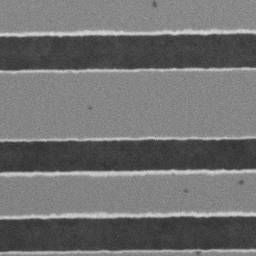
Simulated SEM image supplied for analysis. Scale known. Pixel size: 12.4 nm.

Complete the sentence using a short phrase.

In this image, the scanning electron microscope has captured lines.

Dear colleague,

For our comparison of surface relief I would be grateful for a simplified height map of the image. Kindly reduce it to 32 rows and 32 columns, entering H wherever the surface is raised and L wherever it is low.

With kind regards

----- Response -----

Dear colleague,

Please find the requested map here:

HHHHHHHHHHHHHHHHHHHHHHHHHHHHHHHH
HHHHHHHHHHHHHHHHHHHHHHHHHHHHHHHH
HHHHHHHHHHHHHHHHHHHHHHHHHHHHHHHH
HHHHHHHHHHHHHHHHHHHHHHHHHHHHHHHH
HHHHLLLHLLLLLLLLLLLLLLLLLLLLLLLL
LLLLLLLLLLLLLLLLLLLLLLLLLLLLLLLL
LLLLLLLLLLLLLLLLLLLLLLLLLLLLLLLL
LLLLLLLLLLLLLLLLLLLLLLLLLLLLLLLL
LLLLLLLLLLLLLLLLLLLLLLLLLLLLLLLL
HHHHHHHHHHHHHHHHHHHHHHHHHHHHHHHH
HHHHHHHHHHHHHHHHHHHHHHHHHHHHHHHH
HHHHHHHHHHHHHHHHHHHHHHHHHHHHHHHH
HHHHHHHHHHHHHHHHHHHHHHHHHHHHHHHH
HHHHHHHHHHHHHHHHHHHHHHHHHHHHHHHH
HHHHHHHHHHHHHHHHHHHHHHHHHHHHHHHH
HHHHHHHHHHHHHHHHHHHHHHHHHHHHHHHH
HHHHHHHHHHHHHHHHHHHHHHHHHHHHHHHH
HHHHHHHHHHHHHHLLLLLLLLLLLLLLLLLL
LLLLLLLLLLLLLLLLLLLLLLLLLLLLLLLL
LLLLLLLLLLLLLLLLLLLLLLLLLLLLLLLL
LLLLLLLLLLLLLLLLLLLLLLLLLLLLLLLL
LLLLHLLHHHHHHHHHHHHHHHHHHHHHHHHH
HHHHHHHHHHHHHHHHHHHHHHHHHHHHHHHH
HHHHHHHHHHHHHHHHHHHHHHHHHHHHHHHH
HHHHHHHHHHHHHHHHHHHHHHHHHHHHHHHH
HHHHHHHHHHHHHHHHHHHHHHHHHHHHHHHH
HHHHHHHHHHHHHHHHHHHHHHHHHHHHHHHH
LLLLLLLLLLLLLLLLLLLLLLLLLLLLLLLL
LLLLLLLLLLLLLLLLLLLLLLLLLLLLLLLL
LLLLLLLLLLLLLLLLLLLLLLLLLLLLLLLL
LLLLLLLLLLLLLLLLLLLLLLLLLLLLLLLL
LHHLLHHHHHHHHHHHHHHHHHHHHHHHHHHH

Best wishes